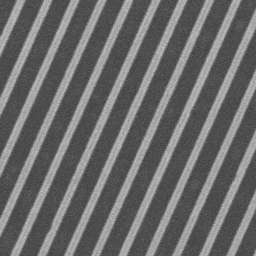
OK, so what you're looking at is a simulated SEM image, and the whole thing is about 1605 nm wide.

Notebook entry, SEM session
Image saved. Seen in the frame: parallel lines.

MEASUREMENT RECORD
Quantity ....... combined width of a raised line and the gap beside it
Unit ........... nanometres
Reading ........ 154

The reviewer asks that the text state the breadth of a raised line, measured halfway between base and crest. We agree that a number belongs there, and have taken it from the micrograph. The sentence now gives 5.93 px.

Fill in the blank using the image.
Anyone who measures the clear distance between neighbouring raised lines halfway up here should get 116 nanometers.